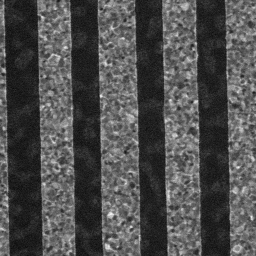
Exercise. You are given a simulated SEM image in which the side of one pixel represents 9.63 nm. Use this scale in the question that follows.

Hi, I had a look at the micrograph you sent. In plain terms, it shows parallel lines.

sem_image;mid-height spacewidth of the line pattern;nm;276